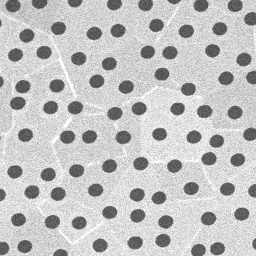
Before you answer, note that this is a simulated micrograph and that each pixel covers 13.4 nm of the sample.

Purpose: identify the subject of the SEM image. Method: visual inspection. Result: a regular array of holes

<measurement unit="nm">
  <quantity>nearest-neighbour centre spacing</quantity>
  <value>334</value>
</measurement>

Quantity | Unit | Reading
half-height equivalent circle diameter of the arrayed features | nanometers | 197